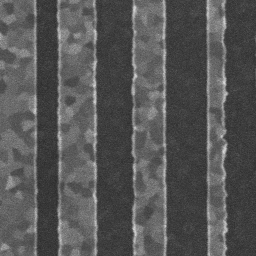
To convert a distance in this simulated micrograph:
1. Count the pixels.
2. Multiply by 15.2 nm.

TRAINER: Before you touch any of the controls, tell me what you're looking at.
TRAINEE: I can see one or a few lines or trenches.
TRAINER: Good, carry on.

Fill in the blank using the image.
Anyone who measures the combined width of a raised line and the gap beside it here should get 1060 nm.